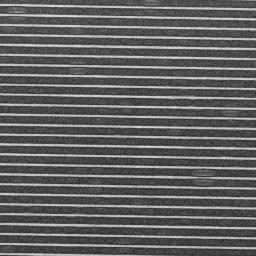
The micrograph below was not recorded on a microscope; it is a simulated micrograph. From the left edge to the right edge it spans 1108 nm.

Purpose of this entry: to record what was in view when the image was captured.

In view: parallel lines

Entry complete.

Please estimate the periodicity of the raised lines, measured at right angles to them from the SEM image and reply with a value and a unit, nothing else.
43.1 nm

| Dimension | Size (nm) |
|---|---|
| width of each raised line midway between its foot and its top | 7.6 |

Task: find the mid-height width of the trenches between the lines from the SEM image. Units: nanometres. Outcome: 36.2